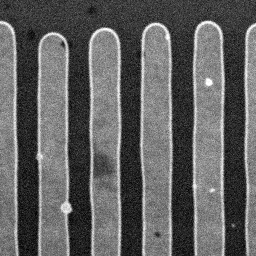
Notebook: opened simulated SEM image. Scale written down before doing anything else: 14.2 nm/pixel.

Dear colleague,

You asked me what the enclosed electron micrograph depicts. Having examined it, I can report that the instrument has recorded groups of lines, slits or small figures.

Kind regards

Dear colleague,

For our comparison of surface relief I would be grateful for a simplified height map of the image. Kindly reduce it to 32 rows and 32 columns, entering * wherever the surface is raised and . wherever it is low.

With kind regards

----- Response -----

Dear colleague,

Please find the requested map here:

................................
................................
................................
*.................***....**....*
**....**....***...***....***...*
**...***...****...***...****...*
**...***...****...***...****...*
**...***...****...***...****...*
**...***...****...***...****...*
**...***...****...***...****...*
**...***...****...***...****...*
**...***...****...***...****...*
**...***...****...***...****...*
**...***...****...***...****...*
**...***...****...***...****...*
**...***...****...***...****...*
**...***...****...***...****...*
**...***...****...***...****...*
**...***...****...***...****...*
**...***...****...***...****...*
**...***...****...***...****...*
**...***...****...***...****...*
**...***...****...***...****...*
**...***...****...***...****...*
**...***...****...***...****...*
**...****..****...***...****...*
**...****...***...***...****...*
**...***....***...***....***...*
**...***....***...***...****...*
**...***....***...***...****...*
**...***....***...***...****...*
**...***....***...***....***...*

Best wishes